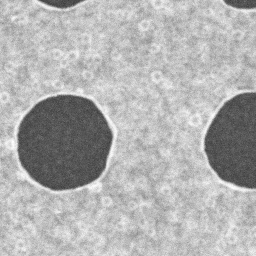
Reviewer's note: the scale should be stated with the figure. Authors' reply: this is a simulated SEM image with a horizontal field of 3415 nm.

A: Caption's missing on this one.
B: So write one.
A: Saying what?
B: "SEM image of holes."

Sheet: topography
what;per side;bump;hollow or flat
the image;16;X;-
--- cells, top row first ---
XXXXXXXXXXXXXXX-
XXXXXXXXXXXXXXXX
XXXXXXXXXXXXXXXX
XXXXXXXXXXXXXXXX
XXXXXXXXXXXXXXXX
XXXXXXXXXXXXXXXX
XX----XXXXXXXX--
X------XXXXXX---
X------XXXXXX---
X------XXXXXX---
X------XXXXXX---
XX----XXXXXXXX--
XXXXXXXXXXXXXXXX
XXXXXXXXXXXXXXXX
XXXXXXXXXXXXXXXX
XXXXXXXXXXXXXXXX